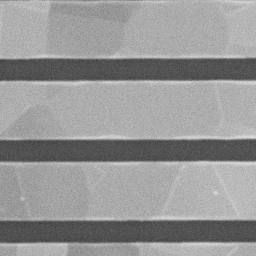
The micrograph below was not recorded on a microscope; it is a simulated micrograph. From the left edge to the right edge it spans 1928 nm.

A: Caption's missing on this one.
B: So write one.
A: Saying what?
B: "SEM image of wiring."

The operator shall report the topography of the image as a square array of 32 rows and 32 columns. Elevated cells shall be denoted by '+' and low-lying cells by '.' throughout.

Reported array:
++++++++++++++++++++++++++++++++
++++++++++++++++++++++++++++++++
++++++++++++++++++++++++++++++++
++++++++++++++++++++++++++++++++
++++++++++++++++++++++++++++++++
++++++++++++++++++++++++++++++++
++++++++++++++++++++++++++++++++
................................
................................
................................
++++++++++++++++++++++++++++++++
++++++++++++++++++++++++++++++++
++++++++++++++++++++++++++++++++
++++++++++++++++++++++++++++++++
++++++++++++++++++++++++++++++++
++++++++++++++++++++++++++++++++
++++++++++++++++++++++++++++++++
................................
................................
................................
+...+++++++++++.+++++++++++++++.
++++++++++++++++++++++++++++++++
++++++++++++++++++++++++++++++++
++++++++++++++++++++++++++++++++
++++++++++++++++++++++++++++++++
++++++++++++++++++++++++++++++++
++++++++++++++++++++++++++++++++
................................
................................
................................
....+++.++....++.+++++++.....+++
++++++++++++++++++++++++++++++++